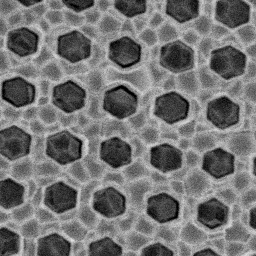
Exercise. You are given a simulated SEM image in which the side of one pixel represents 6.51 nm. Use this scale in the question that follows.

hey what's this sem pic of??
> a regular array of holes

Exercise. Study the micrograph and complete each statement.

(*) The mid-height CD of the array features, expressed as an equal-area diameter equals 214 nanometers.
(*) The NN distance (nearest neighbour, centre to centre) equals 327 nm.